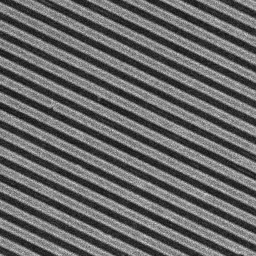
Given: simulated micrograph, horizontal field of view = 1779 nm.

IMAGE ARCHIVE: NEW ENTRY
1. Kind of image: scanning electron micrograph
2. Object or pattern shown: parallel lines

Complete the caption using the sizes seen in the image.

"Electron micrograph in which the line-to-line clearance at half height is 51.5 nanometers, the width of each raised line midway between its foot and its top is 58.6 nm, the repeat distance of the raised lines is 112 nm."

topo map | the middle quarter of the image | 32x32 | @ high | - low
---@@@@@----@@@@@----@@@@-----@@
-----@@@@@----@@@@@----@@@@@----
@@-----@@@@@----@@@@@----@@@@@--
@@@@-----@@@@@----@@@@@----@@@@@
--@@@@-----@@@@@----@@@@@----@@@
----@@@@-----@@@@@----@@@@@----@
@-----@@@@@----@@@@@----@@@@@---
@@@-----@@@@@----@@@@@----@@@@@-
-@@@@-----@@@@@----@@@@@----@@@@
---@@@@-----@@@@-----@@@@@----@@
@----@@@@@----@@@@@----@@@@@----
@@@----@@@@@----@@@@@----@@@@@--
@@@@@----@@@@@----@@@@@----@@@@@
--@@@@@----@@@@@----@@@@@----@@@
----@@@@@----@@@@@----@@@@@----@
@-----@@@@@----@@@@@----@@@@@---
@@@-----@@@@@----@@@@@----@@@@@-
-@@@@-----@@@@@----@@@@@----@@@@
---@@@@-----@@@@@----@@@@@----@@
-----@@@@-----@@@@@----@@@@@----
@@@----@@@@@----@@@@@----@@@@@--
@@@@@----@@@@@----@@@@@-----@@@@
--@@@@@----@@@@@----@@@@@----@@@
----@@@@@----@@@@@----@@@@@----@
@-----@@@@@----@@@@@----@@@@@---
@@@@----@@@@@----@@@@@----@@@@@-
-@@@@-----@@@@@----@@@@@----@@@@
---@@@@-----@@@@@----@@@@@----@@
-----@@@@@----@@@@@----@@@@@----
@@-----@@@@-----@@@@@----@@@@@--
@@@@@----@@@@-----@@@@@----@@@@@
--@@@@@----@@@@@----@@@@@----@@@